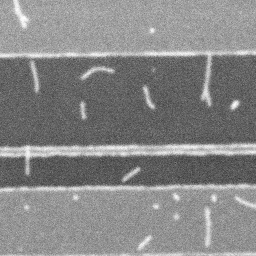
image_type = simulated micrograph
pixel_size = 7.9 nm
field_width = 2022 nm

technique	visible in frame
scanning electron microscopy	lines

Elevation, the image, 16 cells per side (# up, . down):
################
################
################
####............
................
................
................
................
................
.##...........##
................
................
################
################
################
################